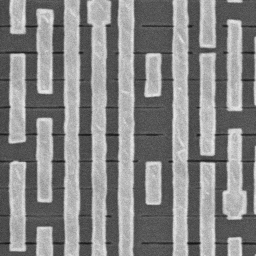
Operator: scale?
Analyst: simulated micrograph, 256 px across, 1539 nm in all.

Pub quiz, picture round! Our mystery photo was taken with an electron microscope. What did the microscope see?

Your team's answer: wiring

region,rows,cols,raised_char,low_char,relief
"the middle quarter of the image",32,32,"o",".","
ooo....ooo....ooo....ooo...oooo.
ooo....ooo....ooo....ooo...oooo.
ooo....ooo....ooo....ooo....ooo.
.oo....ooo....ooo....ooo....ooo.
.oo....ooo....ooo....ooo....ooo.
.oo....ooo....ooo....ooo....ooo.
.oo....ooo....ooo...oooo....ooo.
.oo....ooo....ooo...oooo....ooo.
.oo....ooo....ooo...........ooo.
.oo....ooo....ooo...........ooo.
.oo....ooo....ooo...........ooo.
.oo....ooo....ooo...........ooo.
.oo....ooo....ooo...........ooo.
.oo....ooo....ooo...........ooo.
.oo....ooo....ooo...........ooo.
ooo....ooo....ooo...........ooo.
ooo....ooo....ooo...........ooo.
.oo....ooo....ooo..........oooo.
.oo....ooo....ooo..........oooo.
.oo....ooo....ooo..........oooo.
.oo....ooo....ooo..........oooo.
ooo....ooo....ooo..........oooo.
ooo....ooo....ooo..........oooo.
ooo....ooo....ooo..........oooo.
.oo....ooo....ooo..........oooo.
.oo....ooo....ooo....ooo...oooo.
.oo....ooo....ooo....ooo...oooo.
.oo....ooo....ooo....ooo....ooo.
.oo....ooo....ooo....ooo....ooo.
.oo....ooo....ooo....ooo....ooo.
.oo....ooo....ooo....ooo....ooo.
.oo....ooo....ooo....ooo....ooo.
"